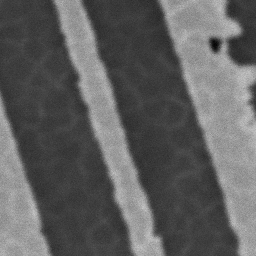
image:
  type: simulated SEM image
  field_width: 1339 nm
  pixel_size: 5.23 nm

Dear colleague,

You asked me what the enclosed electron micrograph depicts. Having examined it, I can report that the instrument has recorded one or a few lines or trenches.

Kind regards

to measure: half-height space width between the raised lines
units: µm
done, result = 0.412